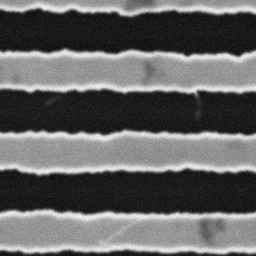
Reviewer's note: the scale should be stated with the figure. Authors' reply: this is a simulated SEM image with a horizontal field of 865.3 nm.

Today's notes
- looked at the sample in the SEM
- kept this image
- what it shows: lines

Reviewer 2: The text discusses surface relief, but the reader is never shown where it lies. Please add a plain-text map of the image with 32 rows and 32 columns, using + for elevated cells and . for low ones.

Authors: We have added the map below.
++++++++++++++++++++++++++++++++
.......+...+...++++.......++++.+
................................
................................
................................
................................
+++++..++++++..+++.++..........+
++++++++++++++++++++++++++++++++
++++++++++++++++++++++++++++++++
++++++++++++++++++++++++++++++++
++++++++++++++++++++++++++++++++
...............+.......+....+++.
................................
................................
................................
................................
...+.+.........++...............
++++++++++++++++++++++++++++++++
++++++++++++++++++++++++++++++++
++++++++++++++++++++++++++++++++
++++++++++++++++++++++++++++++++
...+++++++++...............+....
................................
................................
................................
................................
+++++++.+....+..................
++++++++++++++++++++++++++++++++
++++++++++++++++++++++++++++++++
++++++++++++++++++++++++++++++++
++++++++++++++++++++++++++++++++
...+++..............++...++++..+